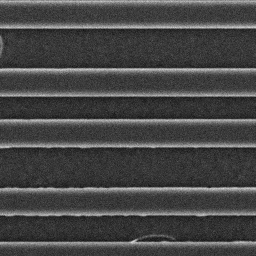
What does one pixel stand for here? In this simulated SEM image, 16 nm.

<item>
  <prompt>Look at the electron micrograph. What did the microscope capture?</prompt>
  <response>lines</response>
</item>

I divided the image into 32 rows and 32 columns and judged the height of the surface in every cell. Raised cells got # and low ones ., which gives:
################################
################################
################################
................................
................................
................................
................................
................................
................................
################################
################################
################################
................................
................................
................................
################################
################################
################################
................................
................................
................................
................................
................................
....................#.#......#..
################################
################################
################################
................................
................................
................................
################################
################################